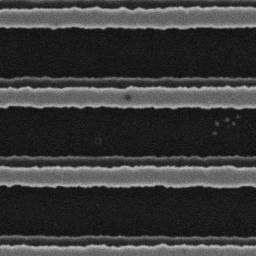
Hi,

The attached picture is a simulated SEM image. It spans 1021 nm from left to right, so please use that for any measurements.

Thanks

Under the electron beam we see lines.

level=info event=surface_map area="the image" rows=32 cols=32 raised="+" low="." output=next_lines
++++++++++++++++++++++++++++++++
++++++++++++++++++++++++++++++++
++++++++++++++++++++++++++++++++
......+.....+...+..++.++........
................................
................................
................................
................................
................................
................................
++++++++++++++++++++++++++++++++
++++++++++++++++++++++++++++++++
++++++++++++++++++++++++++++++++
+...+..........+++.+++...++.++++
................................
................................
................................
................................
................................
.............................+..
++++++++++++++++++++++++++++++++
++++++++++++++++++++++++++++++++
++++++++++++++++++++++++++++++++
................................
................................
................................
................................
................................
................................
................................
++++++++++++++++++++++++++++++++
++++++++++++++++++++++++++++++++